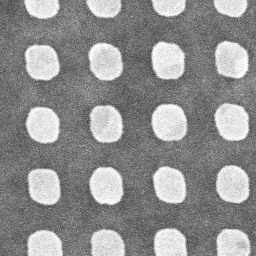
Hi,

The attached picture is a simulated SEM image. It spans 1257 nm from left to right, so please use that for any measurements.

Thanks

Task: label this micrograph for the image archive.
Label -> a regular array of raised bodies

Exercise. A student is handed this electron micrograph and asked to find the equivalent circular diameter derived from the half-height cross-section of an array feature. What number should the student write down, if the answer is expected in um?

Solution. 0.172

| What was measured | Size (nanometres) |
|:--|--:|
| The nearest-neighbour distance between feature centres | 305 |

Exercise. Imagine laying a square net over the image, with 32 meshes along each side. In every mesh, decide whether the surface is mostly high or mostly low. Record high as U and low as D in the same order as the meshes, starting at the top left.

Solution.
DDDUUUUDDDDUUUUDDDDUUUUDDDDUUUUD
DDDDUUUDDDDDUUUDDDDDUUUDDDDDUUDD
DDDDDDDDDDDDDDDDDDDDDDDDDDDDDDDD
DDDDDDDDDDDDDDDDDDDDDDDDDDDDDDDD
DDDDDDDDDDDDDDDDDDDDDDDDDDDDDDDD
DDDDDDDDDDDDUDDDDDDDUDDDDDDDUUDD
DDDUUUUDDDDUUUUDDDDUUUUDDDDUUUUD
DDDUUUUDDDDUUUUDDDDUUUUDDDDUUUUD
DDDUUUUDDDDUUUUDDDDUUUUDDDDUUUUD
DDDDUUUDDDDDUUUDDDDDUUDDDDDDUUDD
DDDDDDDDDDDDDDDDDDDDDDDDDDDDDDDD
DDDDDDDDDDDDDDDDDDDDDDDDDDDDDDDD
DDDDDDDDDDDDDDDDDDDDDDDDDDDDDDDD
DDDDUDDDDDDDUUDDDDDDUUDDDDDUUUDD
DDDDUUUDDDDUUUUDDDDUUUUDDDDUUUUD
DDDUUUUDDDDUUUUDDDDUUUUDDDDUUUUD
DDDDUUUDDDDDUUUDDDDUUUUDDDDUUUUD
DDDDDUUDDDDDUUUDDDDDDUDDDDDDDDDD
DDDDDDDDDDDDDDDDDDDDDDDDDDDDDDDD
DDDDDDDDDDDDDDDDDDDDDDDDDDDDDDDD
DDDDDDDDDDDDDDDDDDDDDDDDDDDDDDDD
DDDDUUUDDDDDUUUDDDDDUUDDDDDDUUDD
DDDDUUUDDDDUUUUDDDDUUUUDDDDUUUUD
DDDDUUUDDDDUUUUDDDDUUUUDDDDUUUUD
DDDDUUUDDDDDUUUDDDDDUUUDDDDDUUUD
DDDDDDDDDDDDDDDDDDDDDDDDDDDDDDDD
DDDDDDDDDDDDDDDDDDDDDDDDDDDDDDDD
DDDDDDDDDDDDDDDDDDDDDDDDDDDDDDDD
DDDDDDDDDDDDDDDDDDDDDDDDDDDDDDDD
DDDDUUUDDDDDUUUDDDDDUUUDDDDUUUUD
DDDDUUUUDDDDUUUDDDDUUUUDDDDUUUUD
DDDDUUUUDDDDUUUDDDDUUUUDDDDUUUUD